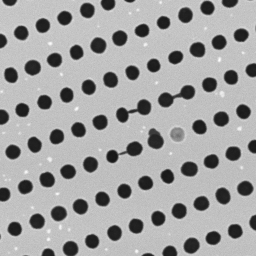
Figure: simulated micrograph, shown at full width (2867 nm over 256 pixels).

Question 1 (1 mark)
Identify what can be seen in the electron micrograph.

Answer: a regular array of holes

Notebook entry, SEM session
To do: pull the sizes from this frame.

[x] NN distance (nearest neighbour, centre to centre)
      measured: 256 nm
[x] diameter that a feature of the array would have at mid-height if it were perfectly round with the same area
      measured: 166 nm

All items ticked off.